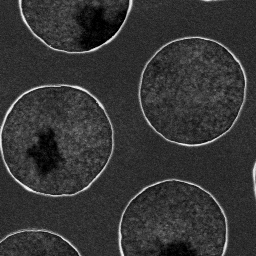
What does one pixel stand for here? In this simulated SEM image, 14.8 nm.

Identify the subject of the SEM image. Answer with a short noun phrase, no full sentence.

holes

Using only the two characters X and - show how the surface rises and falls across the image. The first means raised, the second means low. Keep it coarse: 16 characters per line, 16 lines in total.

X-------XXXXXXXX
XX------XXXXXXXX
XXX----XXXX--XXX
XXXXXXXXXX-----X
XXXXXXXXX------X
XXX--XXXX------X
X-----XXX------X
-------XX------X
-------XXX----XX
-------XXXXXXXXX
X-----XXXXXXXXXX
X-----XXXX--XXXX
XXXXXXXX-----XXX
XXXXXXXX------XX
X--XXXXX------XX
-----XXX------XX